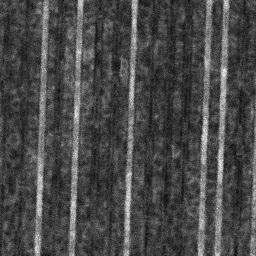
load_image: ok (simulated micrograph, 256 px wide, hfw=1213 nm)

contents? parallel lines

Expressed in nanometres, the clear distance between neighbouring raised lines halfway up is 64.5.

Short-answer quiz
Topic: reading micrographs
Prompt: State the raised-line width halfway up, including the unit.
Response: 20.1 nm